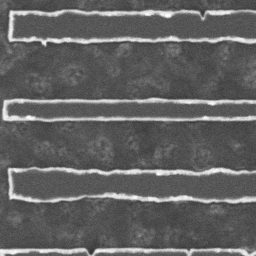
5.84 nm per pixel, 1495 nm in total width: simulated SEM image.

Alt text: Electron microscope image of one or a few lines or trenches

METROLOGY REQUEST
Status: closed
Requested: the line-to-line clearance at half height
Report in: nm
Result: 300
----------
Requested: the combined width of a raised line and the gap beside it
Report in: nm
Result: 461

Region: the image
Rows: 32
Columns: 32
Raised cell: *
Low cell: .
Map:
................................
...*...***........**.****.******
.*******************************
.*******************************
.*******************************
................................
................................
................................
................................
................................
................................
................................
..................***...........
********************************
********************************
................................
................................
................................
................................
................................
................................
.************.*.********..***.*.
.*******************************
.*******************************
.************.******************
................................
................................
................................
................................
................................
................................
***********.*******************.